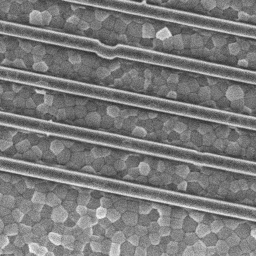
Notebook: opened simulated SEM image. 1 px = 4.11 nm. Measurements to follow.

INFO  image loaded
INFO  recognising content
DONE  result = parallel lines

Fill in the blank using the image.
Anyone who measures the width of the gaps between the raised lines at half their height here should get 133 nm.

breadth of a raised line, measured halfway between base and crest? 49.4 nanometers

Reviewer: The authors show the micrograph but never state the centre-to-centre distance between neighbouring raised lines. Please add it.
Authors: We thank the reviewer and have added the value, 183 nm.